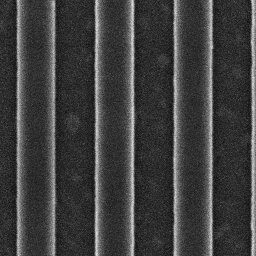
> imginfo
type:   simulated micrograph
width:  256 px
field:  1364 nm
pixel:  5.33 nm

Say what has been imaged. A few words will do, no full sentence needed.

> one or a few lines or trenches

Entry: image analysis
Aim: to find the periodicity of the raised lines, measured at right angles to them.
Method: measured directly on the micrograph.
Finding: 418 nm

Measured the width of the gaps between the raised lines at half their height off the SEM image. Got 218 nm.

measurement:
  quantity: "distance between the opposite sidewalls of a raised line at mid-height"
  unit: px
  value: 37.6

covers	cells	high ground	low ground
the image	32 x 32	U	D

DDUUUUUDDDDDUUUUUDDDDDUUUUDDDDDD
DDUUUUUDDDDDUUUUUDDDDDUUUUDDDDDD
DDUUUUUDDDDDUUUUUDDDDDUUUUDDDDDD
DDUUUUUDDDDDUUUUUDDDDDUUUUDDDDDD
DDUUUUUDDDDDUUUUUDDDDDUUUUDDDDDD
DDUUUUUDDDDDUUUUUDDDDDUUUUUDDDDD
DDUUUUUDDDDDUUUUUDDDDDUUUUUDDDDD
DDUUUUUDDDDDUUUUUDDDDDUUUUDDDDDD
DDUUUUUDDDDDUUUUUDDDDDUUUUDDDDDD
DDUUUUUDDDDDUUUUUDDDDDUUUUDDDDDD
DDUUUUUDDDDDUUUUUDDDDDUUUUDDDDDD
DDUUUUUDDDDDUUUUUDDDDDUUUUDDDDDD
DDUUUUUDDDDDUUUUUDDDDDUUUUDDDDDD
DDUUUUUDDDDDUUUUUDDDDDUUUUDDDDDD
DDUUUUUDDDDDUUUUUDDDDDUUUUDDDDDD
DDUUUUUDDDDDUUUUUDDDDDUUUUDDDDDD
DDUUUUUDDDDDUUUUUDDDDDUUUUDDDDDD
DDUUUUUDDDDDUUUUUDDDDDUUUUDDDDDD
DDUUUUUDDDDDUUUUUDDDDDUUUUDDDDDD
DDUUUUUDDDDDUUUUUDDDDDUUUUDDDDDD
DDUUUUUDDDDDUUUUUDDDDDUUUUDDDDDD
DDUUUUUDDDDDUUUUUDDDDDUUUUDDDDDD
DDUUUUUDDDDDUUUUUDDDDDUUUUDDDDDD
DDUUUUUDDDDDUUUUUDDDDDUUUUDDDDDD
DDUUUUUDDDDDUUUUUDDDDDUUUUDDDDDD
DDUUUUUDDDDDUUUUUDDDDDUUUUDDDDDD
DDUUUUUDDDDDUUUUUDDDDDUUUUDDDDDD
DDUUUUUDDDDDUUUUUDDDDDUUUUDDDDDD
DDUUUUUDDDDDUUUUUDDDDDUUUUDDDDDD
DDUUUUUDDDDDUUUUUDDDDDUUUUDDDDDD
DDUUUUUDDDDDUUUUUDDDDDUUUUDDDDDD
DDUUUUUDDDDDUUUUUDDDDDUUUUDDDDDD